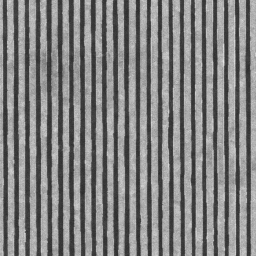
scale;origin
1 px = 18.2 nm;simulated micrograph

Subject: parallel lines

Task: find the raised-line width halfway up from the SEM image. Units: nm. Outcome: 107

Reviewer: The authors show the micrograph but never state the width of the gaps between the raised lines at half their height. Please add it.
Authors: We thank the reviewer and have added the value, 95.5 nanometers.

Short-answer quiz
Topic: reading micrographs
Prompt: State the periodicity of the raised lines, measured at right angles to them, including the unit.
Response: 0.201 µm